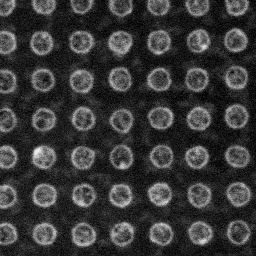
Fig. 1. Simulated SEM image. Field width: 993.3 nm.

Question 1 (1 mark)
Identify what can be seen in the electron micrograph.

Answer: a regular array of raised bodies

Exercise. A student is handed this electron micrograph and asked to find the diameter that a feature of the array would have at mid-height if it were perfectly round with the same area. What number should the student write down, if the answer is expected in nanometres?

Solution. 81.4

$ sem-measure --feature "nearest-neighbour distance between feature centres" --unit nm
145